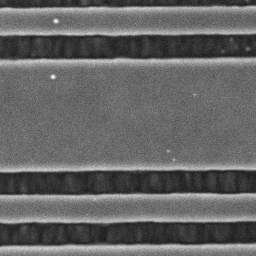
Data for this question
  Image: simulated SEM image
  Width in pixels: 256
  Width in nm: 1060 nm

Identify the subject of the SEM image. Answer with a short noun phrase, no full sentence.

lines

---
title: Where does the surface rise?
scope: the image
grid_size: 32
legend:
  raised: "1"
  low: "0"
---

00000000000000000000000000000000
11111111111111111111111111111111
11111111111111111111111111111111
11111111111111111111111111111111
00000000000000000000000000000000
00000000000000000000000000000000
00000000000000000000000000000000
00111111111111111111111111111111
11111111111111111111111111111111
11111111111111111111111111111111
11111111111111111111111111111111
11111111111111111111111111111111
11111111111111111111111111111111
11111111111111111111111111111111
11111111111111111111111111111111
11111111111111111111111111111111
11111111111111111111111111111111
11111111111111111111111111111111
11111111111111111111111111111111
11111111111111111111111111111111
11111111111111111111111111111111
11100000000000000000000000000000
00000000000000000000000000000000
00000000000000000000000000000000
11111111111111111111111111111111
11111111111111111111111111111111
11111111111111111111111111111111
11111111111111111111111111111111
00000000000000000000000000000000
00000000000000000000000000000000
00000000000000000000000000000000
11111111111111111111111111111111